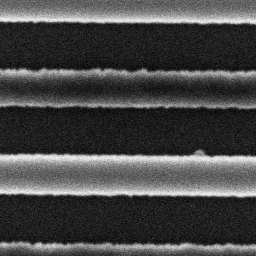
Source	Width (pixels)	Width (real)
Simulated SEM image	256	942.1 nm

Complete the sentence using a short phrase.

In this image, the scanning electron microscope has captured lines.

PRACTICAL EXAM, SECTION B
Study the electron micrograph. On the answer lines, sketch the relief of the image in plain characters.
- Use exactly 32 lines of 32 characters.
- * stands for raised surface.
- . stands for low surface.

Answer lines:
********************************
********************************
********************************
................................
................................
................................
................................
................................
................................
********************************
********************************
********************************
********************************
................................
................................
................................
................................
................................
................................
**********...*..................
********************************
********************************
********************************
********************************
..............................*.
................................
................................
................................
................................
................................
***.............................
********************************